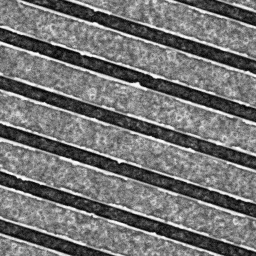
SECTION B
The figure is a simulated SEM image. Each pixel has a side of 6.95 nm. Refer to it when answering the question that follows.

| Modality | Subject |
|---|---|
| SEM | parallel lines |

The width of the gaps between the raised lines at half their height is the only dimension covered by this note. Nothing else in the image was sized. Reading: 96.2 nanometres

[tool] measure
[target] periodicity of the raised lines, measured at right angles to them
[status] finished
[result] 317 nm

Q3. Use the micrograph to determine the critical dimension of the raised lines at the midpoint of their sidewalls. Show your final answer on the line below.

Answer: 224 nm